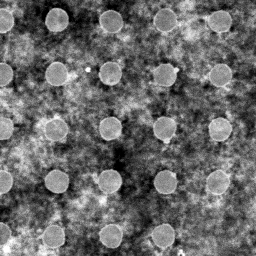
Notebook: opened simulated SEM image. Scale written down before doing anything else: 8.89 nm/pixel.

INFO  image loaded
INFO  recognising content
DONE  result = a regular array of raised bodies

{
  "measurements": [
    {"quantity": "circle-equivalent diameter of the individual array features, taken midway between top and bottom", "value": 204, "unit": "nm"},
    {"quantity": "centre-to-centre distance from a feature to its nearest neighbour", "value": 52.7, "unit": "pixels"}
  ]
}